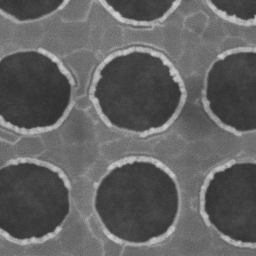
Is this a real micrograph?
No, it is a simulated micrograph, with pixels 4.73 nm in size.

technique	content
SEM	holes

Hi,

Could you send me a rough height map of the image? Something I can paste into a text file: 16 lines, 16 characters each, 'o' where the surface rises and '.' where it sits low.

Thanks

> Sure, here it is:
....ooo....ooo..
oooooooooooooooo
oooooooooooooooo
o..oooo...oooo..
....oo.....oo...
....oo.....oo...
....oo.....oo...
....ooo....ooo..
oooooooooooooooo
oooooooooooooooo
...oooo...oooo..
....oo.....oo...
....oo.....oo...
....oo.....oo...
...oooo...oooo..
oooooooooooooooo